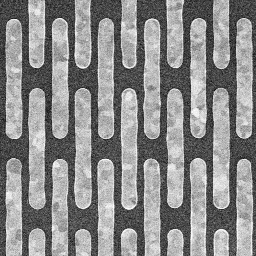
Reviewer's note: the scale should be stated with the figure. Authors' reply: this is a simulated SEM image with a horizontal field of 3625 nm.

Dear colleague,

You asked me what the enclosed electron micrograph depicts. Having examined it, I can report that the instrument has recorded groups of lines, slits or small figures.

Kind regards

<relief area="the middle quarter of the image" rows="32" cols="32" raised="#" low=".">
#...##...###...##...####...##...
#........###........####........
#........###........####........
#........###........####........
#........###........####........
#........###........####........
#...##...###....#...####...#....
#..####..###...###..####..###...
#..####..###...###..####..####..
#..####..###...###..####..####..
#..####..###...###..####..####..
#..####..###...###..####..####..
#..####..###..####..####..####..
#..####..###..####..####..####..
#..####..###..####..####..####..
#..####..###..####..####..####..
#..####..###..####..####..####..
#..####..###..####..####..####..
...####...#...####....#...####..
...####........###........####..
...####........###........####..
...####........###........####..
...####........###........####..
...####........###........####..
...####..###...###..###...####..
#..####..###...###..####..####..
#..####..###...###..####..####..
#..####..###...###..####..####..
#..####..###...###..####..####..
#..####..###...###..####..####..
#..####..###...###..####..####..
#..####..###...###..####..####..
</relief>